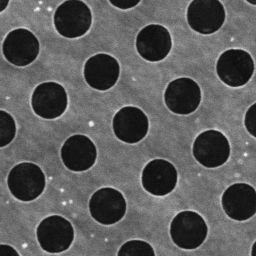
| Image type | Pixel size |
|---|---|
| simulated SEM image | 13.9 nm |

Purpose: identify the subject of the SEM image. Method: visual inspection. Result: a regular array of holes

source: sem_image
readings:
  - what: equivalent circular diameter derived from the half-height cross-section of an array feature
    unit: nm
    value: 518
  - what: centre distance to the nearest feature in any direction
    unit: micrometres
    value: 0.828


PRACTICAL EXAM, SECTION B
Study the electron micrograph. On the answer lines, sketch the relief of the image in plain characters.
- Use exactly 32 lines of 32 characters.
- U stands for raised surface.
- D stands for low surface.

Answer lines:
DUUUUUUUDDDUUUDDDUUUUUUUDDDDUUUD
UUUUUUUDDDDUUUUUUUUUUUUDDDDDUUUU
UUUUUUUDDDDUUUUUUUUUUUUDDDDDUUUU
UUUUUUUDDDDUUUUUUUDDDUUUDDDUUUUU
UDDDUUUUDDUUUUUUUDDDDUUUUUUUUUUU
DDDDDUUUUUUUUUUUUDDDDUUUUUUUUUUU
DDDDDUUUUUUUUUUUUDDDDUUUUUUUDDDU
UDDDUUUUUUUDDDUUUUDDUUUUUUUDDDDD
UUUUUUUUUUUDDDDUUUUUUUUUUUUDDDDD
UUUUUUUUUUUDDDDUUUUUUUUUUUUDDDDU
UUUUUDDUUUUDDDUUUUUUUDDDDUUUDDDU
UUUUDDDDUUUUUUUUUUUUUDDDDUUUUUUU
UUUUDDDDUUUUUUUUUUUUUDDDDUUUUUUU
UUUUDDDDUUUUUUUDDUUUUDDDDUUUUUUD
DUUUUDDUUUUUUUDDDDUUUUUUUUUUUUUD
DDUUUUUUUUUUUUDDDDDUUUUUUUUUUUUD
DDUUUUUUUUUUUUDDDDUUUUUUUDDUUUUD
DDUUUUUUDDDUUUUDDDUUUUUUDDDDUUUU
UUUUUUUUDDDDUUUUUUUUUUUUDDDDDUUU
UUUUUUUUDDDDUUUUUUUUUUUUDDDDDUUU
UUDDUUUUDDDDUUUUUUDDDUUUUDDDUUUU
UDDDDUUUUUUUUUUUUUDDDDUUUUUUUUUU
UDDDDDUUUUUUUUUUUUDDDDUUUUUUUUUU
UDDDDDUUUUUUUDUUUUDDDDUUUUUUDDDD
UUDDDUUUUUUDDDDUUUUUUUUUUUUUDDDD
UUUUUUUUUUUDDDDDUUUUUUUUUUUUDDDD
UUUUUUUUUUUDDDDDUUUUUUUDUUUUDDDD
UUUUUDDDUUUUDDDUUUUUUUDDDUUUUDDU
UUUUUDDDDUUUUUUUUUUUUDDDDDUUUUUU
UUUUUDDDDUUUUUUUUUUUUDDDDDUUUUUU
UUUUUDDDDUUUUUUDDDDUUUDDDUUUUUUU
DDUUUUDDUUUUUUUDDDDUUUUUUUUUUUUD